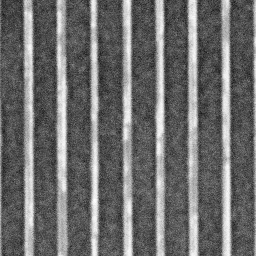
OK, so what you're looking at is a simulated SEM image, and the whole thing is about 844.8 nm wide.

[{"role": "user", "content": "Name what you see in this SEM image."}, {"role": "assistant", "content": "parallel lines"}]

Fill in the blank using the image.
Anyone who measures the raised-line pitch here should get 108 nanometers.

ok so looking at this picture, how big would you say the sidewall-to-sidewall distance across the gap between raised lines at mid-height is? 85.7 nanometers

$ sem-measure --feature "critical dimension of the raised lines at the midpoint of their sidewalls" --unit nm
22.7